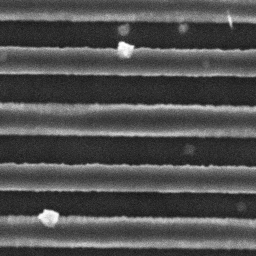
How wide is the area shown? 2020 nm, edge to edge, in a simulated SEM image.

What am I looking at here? lines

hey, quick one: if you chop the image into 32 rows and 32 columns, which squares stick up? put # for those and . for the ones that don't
################################
################################
............................####
................................
................................
...............#................
################################
################################
################################
.......................####..###
................................
................................
................................
#############################...
################################
################################
################################
................................
................................
................................
##.#.#..........................
################################
################################
################################
................................
................................
.....##.........................
###########################.....
################################
################################
..#..###########################
................................